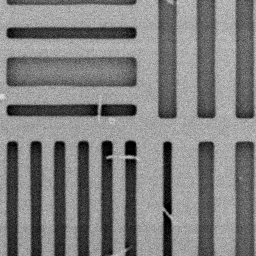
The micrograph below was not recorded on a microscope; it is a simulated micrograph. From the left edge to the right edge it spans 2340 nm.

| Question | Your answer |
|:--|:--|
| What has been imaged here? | groups of lines, slits or small figures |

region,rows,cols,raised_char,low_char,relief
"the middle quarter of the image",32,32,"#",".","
..................#####.....####
..................#####.....####
..................#####.....####
..................#####.....####
..................#####.....####
..................#####.....####
#######################.....####
#######################.....####
#######################.....####
#######################.....####
..................#####.....####
..................#####.....####
........#.........#####.....####
########################....####
################################
################################
################################
################################
################################
####..####..####..#######.######
###...###...###...#######..#####
###...###...###...#######..#####
###...###...###...#######..#####
###...###..##############..#####
.##...###...###...#######..#####
.##...###...###...#######..#####
.##...###...###...#######..#####
.##...###...###...#######..#####
.##...###...###...#######..#####
.##...###...###...#######..#####
.##...###...###...#######..#####
.##...###...###...#######..#####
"